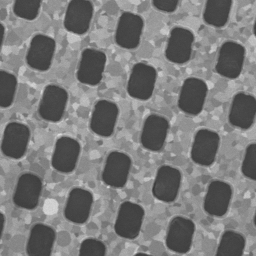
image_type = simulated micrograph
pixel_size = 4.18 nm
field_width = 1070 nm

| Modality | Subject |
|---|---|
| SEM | a regular array of holes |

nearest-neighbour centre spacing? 0.22 um